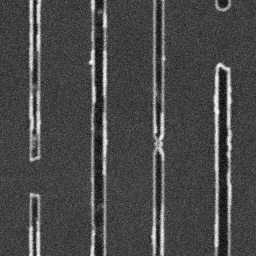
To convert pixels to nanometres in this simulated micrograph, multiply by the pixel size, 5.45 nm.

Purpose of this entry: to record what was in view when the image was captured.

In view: one or a few lines or trenches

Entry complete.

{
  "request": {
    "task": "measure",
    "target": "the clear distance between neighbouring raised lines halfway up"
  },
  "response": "0.286 µm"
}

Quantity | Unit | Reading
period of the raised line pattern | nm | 340